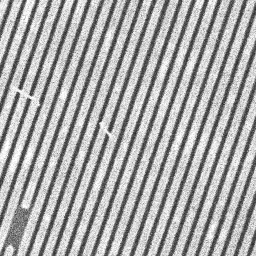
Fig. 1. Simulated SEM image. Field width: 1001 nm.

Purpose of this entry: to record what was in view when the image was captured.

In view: parallel lines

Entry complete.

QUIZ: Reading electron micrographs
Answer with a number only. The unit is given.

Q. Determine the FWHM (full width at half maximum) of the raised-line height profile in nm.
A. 31.9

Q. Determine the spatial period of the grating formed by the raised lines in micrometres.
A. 0.0481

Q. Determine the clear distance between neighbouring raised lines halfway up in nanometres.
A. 18